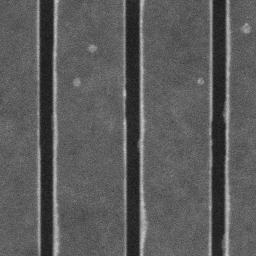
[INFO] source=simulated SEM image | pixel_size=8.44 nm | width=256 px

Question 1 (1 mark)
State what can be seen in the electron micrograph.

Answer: lines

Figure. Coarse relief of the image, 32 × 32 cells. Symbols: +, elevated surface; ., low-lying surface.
+++++..+++++++++..++++++++..++++
+++++..+++++++++..++++++++..++++
+++++..+++++++++..++++++++..++++
+++++..+++++++++..++++++++..++++
+++++..+++++++++..++++++++..++++
+++++..+++++++++..++++++++..++++
+++++..+++++++++..++++++++..++++
+++++..+++++++++..++++++++..++++
+++++..+++++++++..++++++++..++++
+++++..+++++++++..++++++++..++++
+++++..+++++++++..++++++++..++++
+++++..+++++++++..++++++++..++++
+++++..+++++++++..++++++++..++++
+++++..+++++++++..++++++++..++++
+++++..+++++++++..++++++++..++++
+++++..+++++++++..++++++++..++++
+++++..+++++++++..++++++++..++++
+++++..+++++++++..++++++++..++++
+++++..+++++++++..++++++++..++++
+++++..+++++++++..++++++++..++++
+++++..+++++++++..++++++++..++++
+++++..+++++++++..++++++++..++++
+++++..+++++++++..++++++++..++++
+++++..+++++++++..++++++++..++++
+++++..+++++++++..++++++++..++++
+++++..+++++++++..++++++++..++++
+++++..+++++++++..++++++++..++++
+++++..+++++++++..++++++++..++++
+++++..+++++++++..++++++++..++++
+++++..+++++++++..++++++++..++++
+++++..+++++++++..++++++++..++++
+++++..+++++++++..++++++++..++++